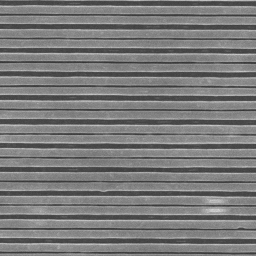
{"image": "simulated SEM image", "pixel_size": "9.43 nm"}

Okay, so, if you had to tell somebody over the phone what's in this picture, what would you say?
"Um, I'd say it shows parallel lines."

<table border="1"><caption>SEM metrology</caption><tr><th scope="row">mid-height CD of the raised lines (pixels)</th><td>8.25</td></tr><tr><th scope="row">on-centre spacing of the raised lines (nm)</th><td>112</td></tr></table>